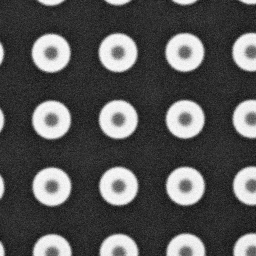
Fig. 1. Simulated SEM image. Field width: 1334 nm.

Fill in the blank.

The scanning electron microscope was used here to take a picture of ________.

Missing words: an array of small figures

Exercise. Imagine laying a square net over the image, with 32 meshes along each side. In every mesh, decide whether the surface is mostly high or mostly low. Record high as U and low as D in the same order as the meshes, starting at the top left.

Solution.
DDDDDDUDDDDDDDUDDDDDDDDDDDDDDDDD
DDDDDDDDDDDDDDDDDDDDDDDDDDDDDDDD
DDDDDDDDDDDDDDDDDDDDDDDDDDDDDDDD
DDDDDDDDDDDDDDDDDDDDDDDDDDDDDDDD
DDDDDUUDDDDDDDUUDDDDDDUUDDDDDDUU
DDDDUUUUDDDDDUUUUDDDDUUUUDDDDUUU
DDDDUUUUUDDDUUUUUDDDDUUUUDDDDUUU
DDDDUUUUUDDDDUUUUDDDDUUUUDDDDUUU
DDDDDUUUDDDDDUUUDDDDDDUUDDDDDDUU
DDDDDDDDDDDDDDDDDDDDDDDDDDDDDDDD
DDDDDDDDDDDDDDDDDDDDDDDDDDDDDDDD
DDDDDDDDDDDDDDDDDDDDDDDDDDDDDDDD
DDDDDDDDDDDDDDDDDDDDDDDDDDDDDDDD
DDDDDUUUDDDDDUUUUDDDDUUUUDDDDDUU
DDDDUUUUUDDDDUUUUDDDDUUUUDDDDUUU
DDDDUUUUUDDDDUUUUDDDDUUUUDDDDUUU
DDDDDUUUDDDDDUUUUDDDDUUUUDDDDDUU
DDDDDDDDDDDDDDDDDDDDDDDDDDDDDDDD
DDDDDDDDDDDDDDDDDDDDDDDDDDDDDDDD
DDDDDDDDDDDDDDDDDDDDDDDDDDDDDDDD
DDDDDDDDDDDDDDDDDDDDDDDDDDDDDDDD
DDDDDUUUDDDDDUUUDDDDDDUUUDDDDDUU
DDDDUUUUUDDDDUUUUDDDDUUUUDDDDUUU
DDDDUUUUUDDDDUUUUDDDDUUUUDDDDUUU
DDDDUUUUDDDDDUUUUDDDDUUUUDDDDDUU
DDDDDDUDDDDDDDUUDDDDDDUUDDDDDDDU
DDDDDDDDDDDDDDDDDDDDDDDDDDDDDDDD
DDDDDDDDDDDDDDDDDDDDDDDDDDDDDDDD
DDDDDDDDDDDDDDDDDDDDDDDDDDDDDDDD
DDDDDDUDDDDDDDUUDDDDDDUUDDDDDDDU
DDDDDUUUUDDDDUUUUDDDDUUUUDDDDDUU
DDDDUUUUUDDDDUUUUDDDDUUUUUDDDUUU